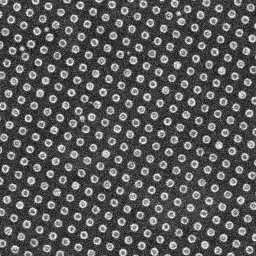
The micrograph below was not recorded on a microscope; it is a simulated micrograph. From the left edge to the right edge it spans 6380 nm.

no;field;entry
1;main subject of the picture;a regular array of raised bodies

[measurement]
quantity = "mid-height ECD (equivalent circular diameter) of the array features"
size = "0.159 microns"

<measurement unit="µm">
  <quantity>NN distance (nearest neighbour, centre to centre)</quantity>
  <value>0.34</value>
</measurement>